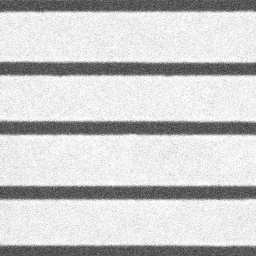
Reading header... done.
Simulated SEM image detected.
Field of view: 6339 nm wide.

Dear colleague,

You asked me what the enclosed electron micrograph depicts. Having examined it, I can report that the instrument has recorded lines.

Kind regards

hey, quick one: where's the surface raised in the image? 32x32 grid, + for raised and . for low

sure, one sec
................................
.............................+++
++++++++++++++++++++++++++++++++
++++++++++++++++++++++++++++++++
++++++++++++++++++++++++++++++++
++++++++++++++++++++++++++++++++
++++++++++++++++++++++++++++++++
++++++++++++++++++++++++++++++++
................................
................................
++++++++++++++++++++++++++++++++
++++++++++++++++++++++++++++++++
++++++++++++++++++++++++++++++++
++++++++++++++++++++++++++++++++
++++++++++++++++++++++++++++++++
................................
................................
++++++++++++++++++++++++++++++++
++++++++++++++++++++++++++++++++
++++++++++++++++++++++++++++++++
++++++++++++++++++++++++++++++++
++++++++++++++++++++++++++++++++
++++++++++++++++++++++++++++++++
................................
................................
++++++++++++++++++++++++++++++++
++++++++++++++++++++++++++++++++
++++++++++++++++++++++++++++++++
++++++++++++++++++++++++++++++++
++++++++++++++++++++++++++++++++
++++++++++++++++++++++++++++++++
................................